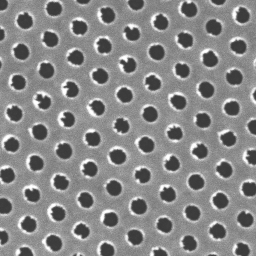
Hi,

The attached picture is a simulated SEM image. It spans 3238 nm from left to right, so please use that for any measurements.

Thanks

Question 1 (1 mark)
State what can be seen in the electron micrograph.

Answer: a regular array of holes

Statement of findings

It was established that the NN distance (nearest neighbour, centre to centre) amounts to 385 nm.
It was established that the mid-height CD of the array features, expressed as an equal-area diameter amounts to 15.6 pixels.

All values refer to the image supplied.